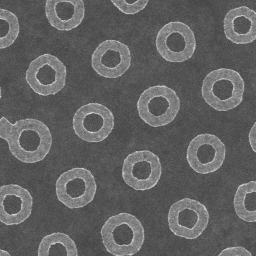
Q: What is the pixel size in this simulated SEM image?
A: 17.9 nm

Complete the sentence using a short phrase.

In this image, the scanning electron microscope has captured a regular array of ring-shaped raised bodies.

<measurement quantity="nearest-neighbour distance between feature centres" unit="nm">1190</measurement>